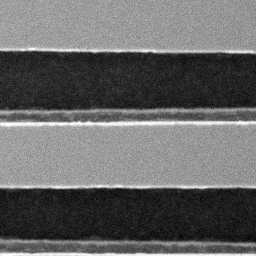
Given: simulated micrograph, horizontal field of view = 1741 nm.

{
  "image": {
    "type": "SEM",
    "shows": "lines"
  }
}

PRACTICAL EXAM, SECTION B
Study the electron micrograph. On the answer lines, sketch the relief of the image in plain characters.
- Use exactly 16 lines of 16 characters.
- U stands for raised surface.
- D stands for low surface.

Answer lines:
UUUUUUUUUUUUUUUU
UUUUUUUUUUUUUUUU
UUUUUUUUUUUUUUUU
DDDDDDDDDDDDDDDD
DDDDDDDDDDDDDDDD
DDDDDDDDDDDDDDDD
DDDDDDDDDDDDDDDD
UUUUUUUUUUUUUUUU
UUUUUUUUUUUUUUUU
UUUUUUUUUUUUUUUU
UUUUUUUUUUUUUUUU
UUUUUUUUUUUUUUUU
DDDDDDDDDDDDDDDD
DDDDDDDDDDDDDDDD
DDDDDDDDDDDDDDDD
UUUUUUUUUUUUUUUD